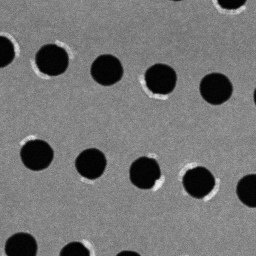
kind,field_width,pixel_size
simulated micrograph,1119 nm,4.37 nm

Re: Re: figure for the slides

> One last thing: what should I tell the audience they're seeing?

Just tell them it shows a regular array of holes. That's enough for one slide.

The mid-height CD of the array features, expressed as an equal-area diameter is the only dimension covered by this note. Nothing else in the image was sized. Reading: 31.5 px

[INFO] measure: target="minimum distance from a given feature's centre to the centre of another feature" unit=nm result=239